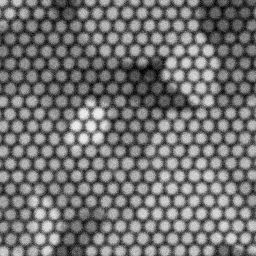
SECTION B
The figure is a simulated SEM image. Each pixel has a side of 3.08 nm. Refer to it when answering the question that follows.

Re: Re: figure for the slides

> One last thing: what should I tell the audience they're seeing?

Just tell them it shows a regular array of raised bodies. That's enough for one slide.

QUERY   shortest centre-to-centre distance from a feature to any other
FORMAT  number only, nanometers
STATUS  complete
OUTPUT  43.4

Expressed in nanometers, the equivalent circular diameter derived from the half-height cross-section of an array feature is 33.3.